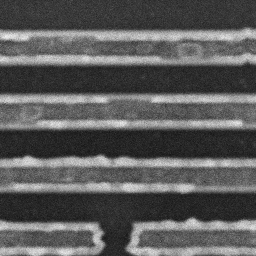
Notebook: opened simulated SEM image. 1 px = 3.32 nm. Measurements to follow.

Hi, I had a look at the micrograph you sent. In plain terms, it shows one or a few lines or trenches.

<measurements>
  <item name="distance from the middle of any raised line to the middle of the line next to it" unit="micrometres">0.212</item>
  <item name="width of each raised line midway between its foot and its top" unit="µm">0.105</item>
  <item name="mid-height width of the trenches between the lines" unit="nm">105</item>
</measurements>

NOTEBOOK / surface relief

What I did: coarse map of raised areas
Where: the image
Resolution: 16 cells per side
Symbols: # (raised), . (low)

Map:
................
................
################
################
................
................
################
################
................
................
################
################
................
................
######..########
######..########